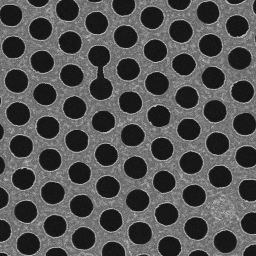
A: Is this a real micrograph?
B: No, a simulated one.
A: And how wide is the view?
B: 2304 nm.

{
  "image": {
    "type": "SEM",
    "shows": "a regular array of holes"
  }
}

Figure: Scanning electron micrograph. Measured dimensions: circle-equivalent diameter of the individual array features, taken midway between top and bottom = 202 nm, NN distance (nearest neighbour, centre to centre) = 288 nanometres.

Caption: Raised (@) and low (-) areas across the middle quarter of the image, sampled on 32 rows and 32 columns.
---@@@@@--@@@------@@@@@@@@-----
----@@@@--@@@------@@@@@@@@@----
-----@@@--@@@------@@@--@@@@@---
-----@@@--@@@@----@@@-----@@@@@@
----@@@-----@@@@@@@@------@@@@@@
@--@@@@-----@@@@@@@@------@@@@@@
@@@@@@------@@@@@@@@@-----@@@---
@@@@@@@-----@@@---@@@@---@@@----
@---@@@@---@@@-----@@@@@@@@@----
-----@@@@@@@@@------@@@@@@@@----
------@@@@@@@@-----@@@@--@@@@---
------@@@@@@@@-----@@-----@@@@@@
-----@@@----@@@@@@@@@-----@@@@@@
@---@@@------@@@@@@@@------@@@@@
@@@@@@@------@@@@@@@@-----@@@---
@@@@@@@-----@@@@---@@@@--@@@----
@@@-@@@@----@@@-----@@@@@@@@----
@----@@@@@@@@@------@@@@@@@@@---
------@@@@@@@@------@@@@-@@@@---
------@@@@@@@@@----@@@-----@@@@@
@-----@@@---@@@@--@@@@-----@@@@@
@@---@@@-----@@@@@@@@@-----@@@@@
@@@@@@@@-----@@@@@@@@@-----@@@--
@@@@@@@@-----@@@@--@@@@---@@@---
@@@-@@@@-----@@-----@@@@@@@@@---
@@----@@@@-@@@@------@@@@@@@@---
@------@@@@@@@@------@@@@@@@@@--
@------@@@@@@@@@----@@@----@@@@@
@-----@@@---@@@@@--@@@------@@@@
@@----@@-----@@@@@@@@@------@@@@
@@@@@@@@------@@@@@@@@------@@@-
@@@@@@@@------@@@@-@@@@----@@@--